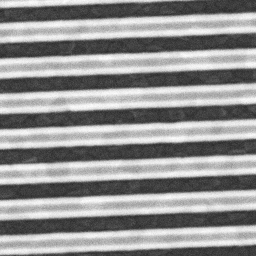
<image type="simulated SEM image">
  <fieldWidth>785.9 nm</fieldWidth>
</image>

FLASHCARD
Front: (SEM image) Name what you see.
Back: parallel lines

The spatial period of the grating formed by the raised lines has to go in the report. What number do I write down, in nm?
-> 109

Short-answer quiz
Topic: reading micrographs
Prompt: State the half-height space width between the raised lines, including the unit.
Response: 61.4 nanometres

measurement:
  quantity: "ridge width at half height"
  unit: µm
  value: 0.0455